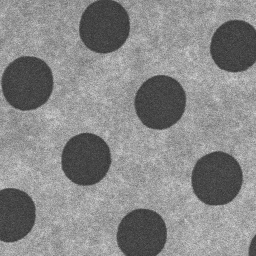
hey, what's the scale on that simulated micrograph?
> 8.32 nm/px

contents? holes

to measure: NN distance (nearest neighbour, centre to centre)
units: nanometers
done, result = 784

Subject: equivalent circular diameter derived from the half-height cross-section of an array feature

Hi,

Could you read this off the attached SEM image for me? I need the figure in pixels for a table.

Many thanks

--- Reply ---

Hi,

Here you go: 53.1